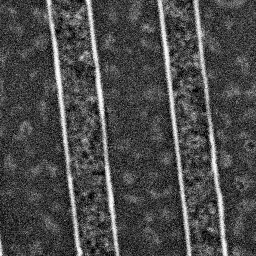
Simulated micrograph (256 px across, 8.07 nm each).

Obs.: one or a few lines or trenches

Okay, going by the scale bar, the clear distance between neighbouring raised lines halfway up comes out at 573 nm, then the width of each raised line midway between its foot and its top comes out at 37.4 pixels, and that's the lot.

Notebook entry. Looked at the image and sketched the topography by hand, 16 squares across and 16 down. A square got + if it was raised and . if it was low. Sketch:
...+++....++....
...+++....++....
...+++....++....
...+++....+++...
....++.....++...
....++.....++...
....++.....++...
....++.....++...
....+++....++...
....+++....++...
....+++....++...
....+++....+++..
.....++....+++..
.....++.....++..
.....++.....++..
.....++.....++..